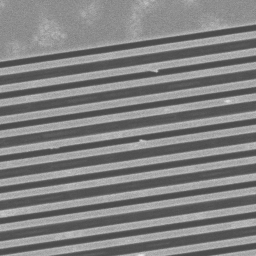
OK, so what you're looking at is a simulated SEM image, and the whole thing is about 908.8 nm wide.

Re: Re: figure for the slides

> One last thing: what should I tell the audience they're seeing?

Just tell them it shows parallel lines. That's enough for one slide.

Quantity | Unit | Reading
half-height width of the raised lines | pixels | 8.28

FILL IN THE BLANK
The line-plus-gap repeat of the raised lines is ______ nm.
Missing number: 55.1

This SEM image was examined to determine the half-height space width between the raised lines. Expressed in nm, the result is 19.7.